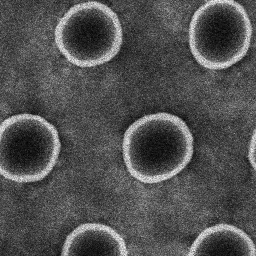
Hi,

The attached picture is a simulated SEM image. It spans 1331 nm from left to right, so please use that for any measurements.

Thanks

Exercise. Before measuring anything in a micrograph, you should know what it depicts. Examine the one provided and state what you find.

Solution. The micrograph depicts raised bodies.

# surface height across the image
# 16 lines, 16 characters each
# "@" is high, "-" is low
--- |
-----@-------@@-
----@@@-----@@@-
----@@@-----@@@-
----@@@-----@@@-
----------------
----------------
----------------
-@@------@@-----
@@@-----@@@@----
@@@-----@@@@----
@@@-----@@@-----
----------------
----------------
----------------
-----@@------@@-
----@@@@----@@@@